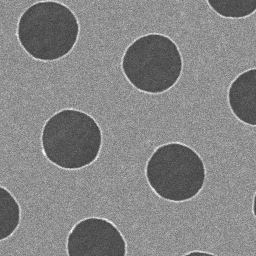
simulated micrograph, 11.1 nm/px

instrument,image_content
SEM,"holes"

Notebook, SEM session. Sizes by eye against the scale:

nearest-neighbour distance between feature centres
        1.22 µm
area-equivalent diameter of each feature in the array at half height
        58.5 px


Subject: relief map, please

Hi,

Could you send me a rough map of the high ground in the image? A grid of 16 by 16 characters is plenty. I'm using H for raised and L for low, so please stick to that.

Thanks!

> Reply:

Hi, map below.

HHLLHHHHHHHHHLLL
HLLLLHHHHHHHHHHH
HLLLLHHHHLLHHHHH
HHLLHHHHLLLHHHHH
HHHHHHHHLLLHHHHL
HHHHHHHHHLHHHHLL
HHHHHHHHHHHHHHLL
HHHLLLHHHHHHHHHL
HHHLLLHHHHHHHHHH
HHHLLLHHHHLLHHHH
HHHHLHHHHLLLLHHH
HHHHHHHHHLLLLHHH
LHHHHHHHHHHHHHHH
LHHHHHHHHHHHHHHH
LHHHLLLHHHHHHHHH
HHHHLLLLHHHHHHHH